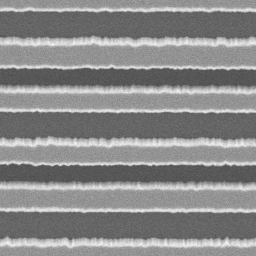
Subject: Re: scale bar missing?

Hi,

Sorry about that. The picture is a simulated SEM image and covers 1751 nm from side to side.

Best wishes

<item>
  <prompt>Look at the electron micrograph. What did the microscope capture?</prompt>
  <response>lines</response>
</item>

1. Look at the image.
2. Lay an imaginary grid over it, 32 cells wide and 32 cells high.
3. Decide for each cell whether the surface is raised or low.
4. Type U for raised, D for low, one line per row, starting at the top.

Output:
UUUUUUUUUUUUUUUUUUUUUUUUUUUUUUUU
DDDDDDDDDDDDDDDDDDDDDDDDDDDDDDDD
DDDDDDDDDDDDDDDDDDDDDDDDDDDDDDDD
DDDDDDDDDDDDDDDDDDDDDDDDDDDDDDDD
DDDDDDDDDDDDDDDDDDDDDDDDDDDDDDDD
UUUUUUUUUUUUUUUUUUUUUUUUUUUUUUUU
UUUUUUUUUUUUUUUUUUUUUUUUUUUUUUUU
UUUUUUUUUUUUUUUUUUUUUUUUUUUUUUUU
UUUUUUUUUUUUUUUUUUUUUUUUUUUUUUUU
DDDDDDDDDDDDDDDDDDDDDDDDDDDDDDDD
DDDDDDDDDDDDDDDDDDDDDDDDDDDDDDDD
UUUUUUUUUUUUUUUUUUUUUUUUUUUUUUUU
UUUUUUUUUUUUUUUUUUUUUUUUUUUUUUUU
UUUUUUUUUUUUUUUUUUUUUUUUUUUUUUUU
DDDDDDDDDDDDDDDDDDDDDDDDDDDDDDDD
DDDDDDDDDDDDDDDDDDDDDDDDDDDDDDDD
DDDDDDDDDDDDDDDDDDDDDDDDDDDDDDDD
UDUDUUUUUUDUUDUUUDDDDUUDDUDDDDDD
UUUUUUUUUUUUUUUUUUUUUUUUUUUUUUUU
UUUUUUUUUUUUUUUUUUUUUUUUUUUUUUUU
DDDDUUUUUUUUUUUUUUUUUUUUUUUUUUUU
DDDDDDDDDDDDDDDDDDDDDDDDDDDDDDDD
DDDDDDDDDDDDDDDDDDDDDDDDDDDDDDDD
UUUUUUUUUUUUUUUUUUUUUUUUUUUUUUUU
UUUUUUUUUUUUUUUUUUUUUUUUUUUUUUUU
UUUUUUUUUUUUUUUUUUUUUUUUUUUUUUUU
DDDDDDDDDDUDDDDDDUDDDUDUDDUUDUUU
DDDDDDDDDDDDDDDDDDDDDDDDDDDDDDDD
DDDDDDDDDDDDDDDDDDDDDDDDDDDDDDDD
DDDDDDDDDDDDDDDDDDDDDDDDDDDDDDDD
UUUUUUUUUUUUUUUUUUUUUUUUUUUUUUUU
UUUUUUUUUUUUUUUUUUUUUUUUUUUUUUUU